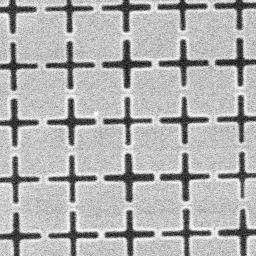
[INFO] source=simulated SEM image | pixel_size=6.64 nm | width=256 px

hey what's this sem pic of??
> an array of small figures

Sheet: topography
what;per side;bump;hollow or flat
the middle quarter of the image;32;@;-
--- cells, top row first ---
--------@-------------@---------
---@@@@@@@@@@@---@@@@@@@@@@@@--@
@-@@@@@@@@@@@@@--@@@@@@@@@@@@--@
@-@@@@@@@@@@@@@--@@@@@@@@@@@@--@
---@@@@@@@@@@@@--@@@@@@@@@@@@--@
---@@@@@@@@@@@@--@@@@@@@@@@@@--@
@-@@@@@@@@@@@@@@@@@@@@@@@@@@@@@@
@@@@@@@@@@@@@@@@@@@@@@@@@@@@@@@@
@--@@@@@@@@@@@@--@@@@@@@@@@@@--@
@--@@@@@@@@@@@@--@@@@@@@@@@@@--@
@--@@@@@@@@@@@@--@@@@@@@@@@@@--@
@--@@@@@@@@@@@@--@@@@@@@@@@@@--@
@--@@@@@@@@@@@@--@@@@@@@@@@@@--@
--------@@------------@@--------
--------@-------------@@--------
--------@@@@@@@--@@@@@@@@@@@@--@
@--@@@@@@@@@@@@--@@@@@@@@@@@@--@
@--@@@@@@@@@@@@--@@@@@@@@@@@@--@
@--@@@@@@@@@@@@--@@@@@@@@@@@@--@
@--@@@@@@@@@@@@--@@@@@@@@@@@@--@
@-@@@@@@@@@@@@@--@@@@@@@@@@@@@@@
@@@@@@@@@@@@@@@@@@@@@@@@@@@@@@@@
@@@@@@@@@@@@@@@--@@@@@@@@@@@@--@
@--@@@@@@@@@@@@--@@@@@@@@@@@@--@
@--@@@@@@@@@@@@---@@@@@@@@@@@--@
@--@@@@@@@@@@@@---@@@@@@@@@@@--@
@--@@@@@@@@@@@@---@@@@@@@@@@@--@
@------@@@-------------@--------
---------@-------------@--------
--------@@------------@@---@@---
@--@@@@@@@@@@@@--@@@@@@@@@@@@---
@--@@@@@@@@@@@@--@@@@@@@@@@@@---